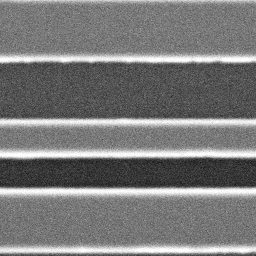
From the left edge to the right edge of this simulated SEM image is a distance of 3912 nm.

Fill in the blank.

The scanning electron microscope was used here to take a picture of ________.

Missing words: lines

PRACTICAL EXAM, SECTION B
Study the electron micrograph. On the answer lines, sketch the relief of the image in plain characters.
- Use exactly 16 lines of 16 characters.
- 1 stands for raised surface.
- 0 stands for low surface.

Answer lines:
1111111111111111
1111111111111111
1111111111111111
1111111111111111
0000000000000000
0000000000000000
0000000000000000
0000000000000000
1111111111111111
1111111111111111
0000000000000000
0000000000000000
1111111111111111
1111111111111111
1111111111111111
1111111111111111